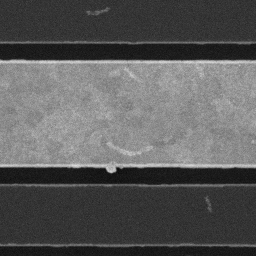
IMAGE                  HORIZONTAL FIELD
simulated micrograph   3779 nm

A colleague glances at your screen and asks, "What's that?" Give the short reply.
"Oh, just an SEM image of lines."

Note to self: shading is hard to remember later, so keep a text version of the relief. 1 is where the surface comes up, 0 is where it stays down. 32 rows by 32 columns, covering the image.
11111111111111111111111111111111
11111111111111111111111111111111
11111111111111111111111111111111
11111111111111111111111111111111
11111111111111111111111111111111
00000000000000000000000000000000
00000000000000000000000000000000
00000000000000000000000000000000
11111111111111111111111111111111
11111111111111111111111111111111
11111111111111111111111111111111
11111111111111111111111111111111
11111111111111111111111111111111
11111111111111111111111111111111
11111111111111111111111111111111
11111111111111111111111111111111
11111111111111111111111111111111
11111111111111111111111111111111
11111111111111111111111111111111
11111111111111111111111111111111
11111111111111111111111111111111
00000000000000000000000000000000
00000000000000000000000000000000
11111111111111111111111111111111
11111111111111111111111111111111
11111111111111111111111111111111
11111111111111111111111111111111
11111111111111111111111111111111
11111111111111111111111111111111
11111111111111111111111111111111
11111111111111111111111111111111
00000000000000000000000000000000